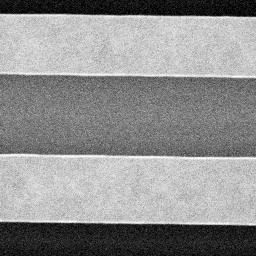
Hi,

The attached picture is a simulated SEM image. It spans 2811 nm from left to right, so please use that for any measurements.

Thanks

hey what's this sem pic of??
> groups of lines, slits or small figures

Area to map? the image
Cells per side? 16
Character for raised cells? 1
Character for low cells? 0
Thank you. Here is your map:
0000000000000000
1111111111111111
1111111111111111
1111111111111111
1111111111111111
0000000000000000
0000000000000000
0000000000000000
0000000000000000
0000000000000000
1111111111111111
1111111111111111
1111111111111111
1111111111111111
0000000000000000
0000000000000000